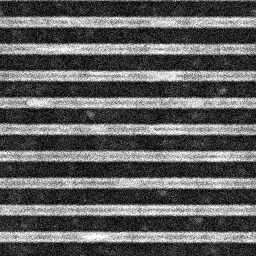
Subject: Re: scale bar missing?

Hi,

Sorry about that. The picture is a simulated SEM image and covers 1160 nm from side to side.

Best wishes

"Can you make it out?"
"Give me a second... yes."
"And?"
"parallel lines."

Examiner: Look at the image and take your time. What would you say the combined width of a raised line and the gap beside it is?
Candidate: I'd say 122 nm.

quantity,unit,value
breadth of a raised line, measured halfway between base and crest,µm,0.0419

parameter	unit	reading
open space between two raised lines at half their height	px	17.7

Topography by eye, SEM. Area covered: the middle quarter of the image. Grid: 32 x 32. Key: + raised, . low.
................................
................................
++++++++++++++++++++++++++++++++
++++++++++++++++++++++++++++++++
................................
................................
................................
................................
................................
++++++++++++++++++++++++++++++++
++++++++++++++++++++++++++++++++
................................
................................
................................
................................
++++++++++++++++++++++++++++++++
++++++++++++++++++++++++++++++++
................................
................................
................................
................................
................................
++++++++++++++++++++++++++++++++
++++++++++++++++++++++++++++++++
................................
................................
................................
................................
................................
++++++++++++++++++++++++++++++++
++++++++++++++++++++++++++++++++
................................